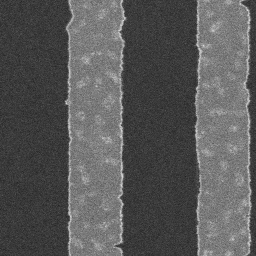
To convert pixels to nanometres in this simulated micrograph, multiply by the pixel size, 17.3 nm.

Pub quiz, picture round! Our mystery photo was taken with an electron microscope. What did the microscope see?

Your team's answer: one or a few lines or trenches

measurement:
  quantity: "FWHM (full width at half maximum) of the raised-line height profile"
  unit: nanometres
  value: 902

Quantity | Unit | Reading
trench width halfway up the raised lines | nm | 1320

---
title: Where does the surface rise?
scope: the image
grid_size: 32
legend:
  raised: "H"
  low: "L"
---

LLLLLLLLLHHHHHHLLLLLLLLLLHHHHHLL
LLLLLLLLLHHHHHHLLLLLLLLLLHHHHHHL
LLLLLLLLLHHHHHHLLLLLLLLLLHHHHHHL
LLLLLLLLHHHHHHHLLLLLLLLLLHHHHHHL
LLLLLLLLLHHHHHHLLLLLLLLLLHHHHHHL
LLLLLLLLLHHHHHHLLLLLLLLLLHHHHHHL
LLLLLLLLLHHHHHHLLLLLLLLLLHHHHHHL
LLLLLLLLLHHHHHHLLLLLLLLLLHHHHHHL
LLLLLLLLLHHHHHHLLLLLLLLLLHHHHHHL
LLLLLLLLLHHHHHHLLLLLLLLLLHHHHHHL
LLLLLLLLLHHHHHHLLLLLLLLLLHHHHHHL
LLLLLLLLLHHHHHHLLLLLLLLLLHHHHHHL
LLLLLLLLHHHHHHHLLLLLLLLLHHHHHHHL
LLLLLLLLLHHHHHHLLLLLLLLLLHHHHHHL
LLLLLLLLLHHHHHHLLLLLLLLLLHHHHHHL
LLLLLLLLLHHHHHHLLLLLLLLLLHHHHHHL
LLLLLLLLLHHHHHHLLLLLLLLLLHHHHHHL
LLLLLLLLLHHHHHHLLLLLLLLLHHHHHHHL
LLLLLLLLLHHHHHHLLLLLLLLLLHHHHHHL
LLLLLLLLLHHHHHHLLLLLLLLLLHHHHHHL
LLLLLLLLLHHHHHHLLLLLLLLLLHHHHHHL
LLLLLLLLLHHHHHHLLLLLLLLLLHHHHHHL
LLLLLLLLLHHHHHHLLLLLLLLLLHHHHHHL
LLLLLLLLLHHHHHHLLLLLLLLLLHHHHHHL
LLLLLLLLLHHHHHHLLLLLLLLLLHHHHHHL
LLLLLLLLLHHHHHHLLLLLLLLLLHHHHHHL
LLLLLLLLLHHHHHHLLLLLLLLLLHHHHHHL
LLLLLLLLLHHHHHHLLLLLLLLLLHHHHHHL
LLLLLLLLLHHHHHHLLLLLLLLLLHHHHHHL
LLLLLLLLLHHHHHHLLLLLLLLLLHHHHHHL
LLLLLLLLLHHHHHHLLLLLLLLLLHHHHHHL
LLLLLLLLLHHHHHHLLLLLLLLLLHHHHHHL